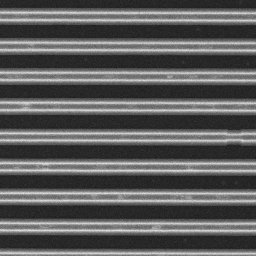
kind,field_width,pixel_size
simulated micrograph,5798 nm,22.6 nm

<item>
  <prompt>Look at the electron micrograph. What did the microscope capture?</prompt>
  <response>parallel lines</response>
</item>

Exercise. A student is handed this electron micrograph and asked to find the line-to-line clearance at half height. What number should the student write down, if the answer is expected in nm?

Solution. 408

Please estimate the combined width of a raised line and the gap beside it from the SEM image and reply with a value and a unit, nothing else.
30 pixels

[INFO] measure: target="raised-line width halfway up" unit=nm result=272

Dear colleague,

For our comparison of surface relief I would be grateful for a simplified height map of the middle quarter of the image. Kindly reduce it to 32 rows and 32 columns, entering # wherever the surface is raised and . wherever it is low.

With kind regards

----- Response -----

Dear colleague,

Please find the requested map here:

................................
................................
################################
################################
################################
................................
................................
................................
................................
################################
################################
################################
................................
................................
................................
................................
................................
################################
################################
.###############################
................................
................................
................................
................................
#####################...........
################################
################################
................................
................................
................................
................................
................................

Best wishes